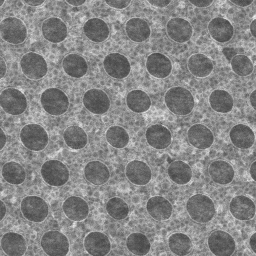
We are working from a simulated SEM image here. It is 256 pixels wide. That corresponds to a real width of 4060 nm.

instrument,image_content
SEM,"a regular array of holes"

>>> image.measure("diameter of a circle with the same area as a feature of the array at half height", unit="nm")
410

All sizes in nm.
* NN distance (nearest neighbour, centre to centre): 652